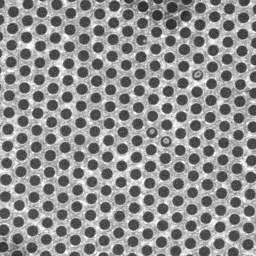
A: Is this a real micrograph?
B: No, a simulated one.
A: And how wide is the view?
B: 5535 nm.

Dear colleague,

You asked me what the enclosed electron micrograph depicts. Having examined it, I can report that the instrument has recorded a regular array of raised bodies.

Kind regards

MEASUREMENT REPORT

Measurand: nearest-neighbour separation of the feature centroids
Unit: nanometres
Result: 354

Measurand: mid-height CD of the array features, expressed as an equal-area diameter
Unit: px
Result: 12.7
